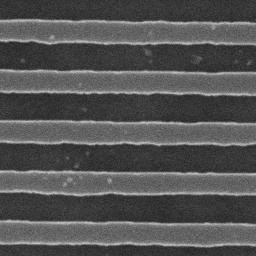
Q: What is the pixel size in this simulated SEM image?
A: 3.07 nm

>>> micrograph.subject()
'lines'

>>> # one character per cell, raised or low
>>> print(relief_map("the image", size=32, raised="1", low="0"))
00000000000000000000000000000000
00000000000000000000000000000000
00000000000000000000000000000000
11111111111111111111111111111111
11111111111111111111111111111111
00000010000001001111001100011111
00000000000000000000000000000000
00000000000000000000000000000000
00000000000000000000000000000000
11111111111111111111111111111111
11111111111111111111111111111111
11111011111111111111111111111111
00000000000000000000000000000000
00000000000000000000000000000000
00000000000000000000000000000000
11111111111111111111111111111111
11111111111111111111111111111111
11111111111111111111111111111111
00000000000000000000000000000000
00000000000000000000000000000000
00000000000000000000000000000000
11011000100000000000000000000000
11111111111111111111111111111111
11111111111111111111111111111111
00000000000000000000000000000000
00000000000000000000000000000000
00000000000000000000000000000000
00000000000000000000000000000000
11111111111111111111111111111111
11111111111111111111111111111111
00000010110011100110111111111111
00000000000000000000000000000000